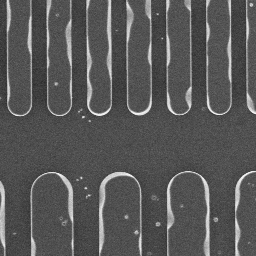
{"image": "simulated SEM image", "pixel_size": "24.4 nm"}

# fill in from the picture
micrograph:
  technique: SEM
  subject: groups of lines, slits or small figures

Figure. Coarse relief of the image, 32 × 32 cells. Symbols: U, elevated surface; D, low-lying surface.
DUUUDDUUUDDUUUDDUUUDDUUUDDUUUDDU
DUUUDDUUUDDUUUDDUUUDDUUUDDUUUDDU
DUUUDDUUUDDUUUDDUUUDDUUUDDUUUDDU
DUUUDDUUUDDUUUDDUUUDDUUUDDUUUDDU
DUUUDDUUUDDUUUDDUUUDDUUUDDUUUDDU
DUUUDDUUUDDUUUDDUUUDDUUUDDUUUDDU
DUUUDDUUUDDUUUDDUUUDDUUUDDUUUDDU
DUUUDDUUUDDUUUDDUUUDDUUUDDUUUDDU
DUUUDDUUUDDUUUDDUUUDDUUUDDUUUDDU
DUUUDDUUUDDUUUDDUUUDDUUUDDUUUDDU
DUUUDDUUUDDUUUDDUUUDDUUUDDUUUDDU
DUUUDDUUUDDUUUDDUUUDDUUUDDUUUDDU
DUUUDDUUUDDUUUDDUUUDDUUUDDUUUDDU
DUUUDDUUUDDUUUDDUUUDDUUUDDUUUDDU
DDDDDDDDDDDDDDDDDDDDDDDDDDDDDDDD
DDDDDDDDDDDDDDDDDDDDDDDDDDDDDDDD
DDDDDDDDDDDDDDDDDDDDDDDDDDDDDDDD
DDDDDDDDDDDDDDDDDDDDDDDDDDDDDDDD
DDDDDDDDDDDDDDDDDDDDDDDDDDDDDDDD
DDDDDDDDDDDDDDDDDDDDDDDDDDDDDDDD
DDDDDDDDDDDDDDDDDDDDDDDDDDDDDDDD
DDDDDDDDDDDDDDDDDDDDDDDUDDDDDDDU
DDDDUUUUDDDDDUUUUDDDDUUUUDDDDDUU
DDDDUUUUUDDDDUUUUDDDDUUUUUDDDDUU
DDDDUUUUUDDDDUUUUUDDDUUUUUDDDDUU
DDDDUUUUUDDDDUUUUUDDDUUUUUDDDDUU
DDDDUUUUUDDDDUUUUUDDDUUUUUDDDUUU
DDDDUUUUUDDDDUUUUUDDDUUUUUDDDUUU
DDDDUUUUUDDDDUUUUUDDDUUUUUDDDDUU
DDDDUUUUUDDDDUUUUUDDDUUUUUDDDDUU
UDDDUUUUUDDDDUUUUDDDDUUUUUDDDDUU
UDDDUUUUUDDDDUUUUUDDDUUUUUDDDDUU